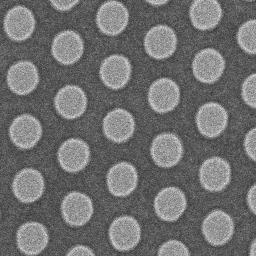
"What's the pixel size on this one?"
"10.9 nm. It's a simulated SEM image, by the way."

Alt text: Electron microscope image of a regular array of raised bodies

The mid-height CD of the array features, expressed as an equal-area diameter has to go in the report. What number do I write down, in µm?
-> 0.358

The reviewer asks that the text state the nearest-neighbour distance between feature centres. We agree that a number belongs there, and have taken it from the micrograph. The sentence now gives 585 nm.